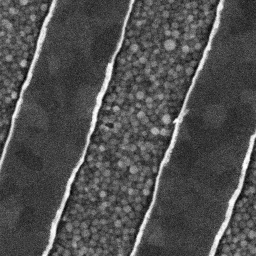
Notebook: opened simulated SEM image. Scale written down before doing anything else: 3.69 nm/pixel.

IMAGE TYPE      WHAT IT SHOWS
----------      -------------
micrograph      one or a few lines or trenches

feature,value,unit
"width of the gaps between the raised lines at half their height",294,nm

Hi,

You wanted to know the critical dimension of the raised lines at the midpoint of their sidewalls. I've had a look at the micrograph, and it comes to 284 nm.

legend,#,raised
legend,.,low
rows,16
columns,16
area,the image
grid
...#####......##
...#####.....###
..######.....###
..#####......###
..#####.....####
.######.....####
.#####......####
.#####.....#####
.#####.....#####
#####.....######
#####.....#####.
####......#####.
####......#####.
####.....#####..
###......#####..
###.....#####...